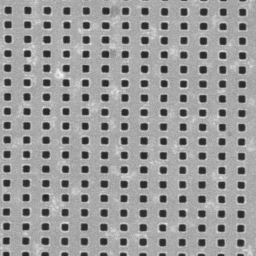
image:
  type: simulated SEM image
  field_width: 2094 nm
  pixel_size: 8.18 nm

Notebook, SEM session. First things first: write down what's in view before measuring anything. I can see a regular array of holes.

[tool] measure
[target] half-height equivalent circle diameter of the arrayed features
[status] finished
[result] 0.0691 micrometres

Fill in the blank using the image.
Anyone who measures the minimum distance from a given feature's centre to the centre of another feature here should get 116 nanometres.